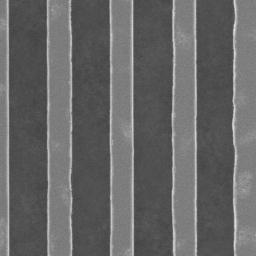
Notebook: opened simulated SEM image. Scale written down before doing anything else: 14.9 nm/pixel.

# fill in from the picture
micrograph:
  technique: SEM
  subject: one or a few lines or trenches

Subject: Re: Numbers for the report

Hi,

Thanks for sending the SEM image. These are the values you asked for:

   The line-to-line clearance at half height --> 0.595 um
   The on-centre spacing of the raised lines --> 0.931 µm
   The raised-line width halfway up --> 341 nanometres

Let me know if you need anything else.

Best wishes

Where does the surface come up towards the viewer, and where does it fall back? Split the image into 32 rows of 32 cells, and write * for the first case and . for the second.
*.....***.....***.....**.....***
*.....***.....***.....**......**
*.....***.....**......**.....***
*.....***.....**......**.....***
*.....***.....**......**.....***
*.....***.....**......**.....***
*.....***.....**......**.....***
*.....***.....**......**.....***
*.....***.....**......**.....***
*.....***.....**......**.....***
*.....***.....**......**.....***
*.....***.....**......**.....***
*.....***.....**......**.....***
*.....***.....**......**.....***
*.....***.....**......**.....***
*.....***.....**......**.....***
*.....***.....***.....**.....***
*.....***.....***.....**.....***
*.....***.....***.....**.....***
*.....***.....***.....**.....***
*.....***.....***.....**.....***
*.....***.....***.....**.....***
*.....***.....***.....**.....***
*.....***.....**......**.....***
*.....***.....***.....**.....***
*.....***.....***.....**.....***
*.....***.....***.....**.....***
*.....***.....***.....**.....***
*.....***.....***.....**.....***
*.....***.....***.....**.....***
*.....***.....***.....**.....***
*.....***.....***.....**.....***